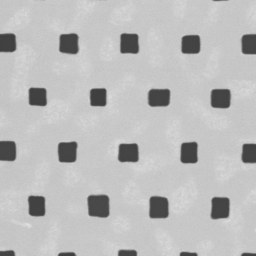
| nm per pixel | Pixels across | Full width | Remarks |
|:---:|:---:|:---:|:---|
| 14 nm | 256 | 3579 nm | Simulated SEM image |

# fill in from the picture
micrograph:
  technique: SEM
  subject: a regular array of holes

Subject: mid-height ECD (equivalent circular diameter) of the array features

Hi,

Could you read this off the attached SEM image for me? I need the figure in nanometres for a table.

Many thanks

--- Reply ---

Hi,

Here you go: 293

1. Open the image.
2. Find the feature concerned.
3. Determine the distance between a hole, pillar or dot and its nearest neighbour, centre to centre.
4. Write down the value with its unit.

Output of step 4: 848 nanometers